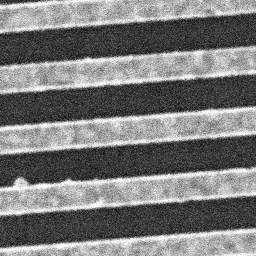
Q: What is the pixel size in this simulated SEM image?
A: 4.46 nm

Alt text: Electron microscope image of parallel lines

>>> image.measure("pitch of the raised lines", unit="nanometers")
271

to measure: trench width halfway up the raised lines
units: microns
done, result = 0.162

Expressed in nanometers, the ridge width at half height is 110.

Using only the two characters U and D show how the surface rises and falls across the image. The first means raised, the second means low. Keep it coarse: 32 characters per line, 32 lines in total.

DDDDDUUUUUUUUUUUUUUUUUUUUUUUUUUU
UUUUUUUUUUUUUUUUUUUUUUUUUUUUUUDD
UUUUUUUUUUUUUUUUUUDDDDDDDDDDDDDD
UUUUDDDDDDDDDDDDDDDDDDDDDDDDDDDD
DDDDDDDDDDDDDDDDDDDDDDDDDDDDDDDD
DDDDDDDDDDDDDDDDDDDDDDDDDDDDDDDD
DDDDDDDDDDDDDDDDDDDDDDDDDUUUUUUU
DDDDDDDDDDDUUUUUUUUUUUUUUUUUUUUU
UUUUUUUUUUUUUUUUUUUUUUUUUUUUUUUU
UUUUUUUUUUUUUUUUUUUUUUUUUDDDDDDD
UUUUUUUUUUUUUDDDDDDDDDDDDDDDDDDD
DDDDDDDDDDDDDDDDDDDDDDDDDDDDDDDD
DDDDDDDDDDDDDDDDDDDDDDDDDDDDDDDD
DDDDDDDDDDDDDDDDDDDDDDDDDDDDDDDD
DDDDDDDDDDDDDDDDDDDDDUUUUUUUUUUU
DDDDDDDDUUUUUUUUUUUUUUUUUUUUUUUU
UUUUUUUUUUUUUUUUUUUUUUUUUUUUUUUU
UUUUUUUUUUUUUUUUUUUUUDDDDDDDDDDD
UUUUUUUDDDDDDDDDDDDDDDDDDDDDDDDD
DDDDDDDDDDDDDDDDDDDDDDDDDDDDDDDD
DDDDDDDDDDDDDDDDDDDDDDDDDDDDDDDD
DDDDDDDDDDDDDDDDDDDDDDDDDDDDUUUU
DDDDDDDDDDDDDDDDUUUUUUUUUUUUUUUU
DDDUUUUUUUUUUUUUUUUUUUUUUUUUUUUU
UUUUUUUUUUUUUUUUUUUUUUUUUUUUDDDD
UUUUUUUUUUUUUUUDDDDDDDDDDDDDDDDD
UUUDDDDDDDDDDDDDDDDDDDDDDDDDDDDD
DDDDDDDDDDDDDDDDDDDDDDDDDDDDDDDD
DDDDDDDDDDDDDDDDDDDDDDDDDDDDDDDD
DDDDDDDDDDDDDDDDDDDDDDDUUUUUUUUU
DDDDDDDDDDUUUUUUUUUUUUUUUUUUUUUU
UUUUUUUUUUUUUUUUUUUUUUUUUUUUUUUU